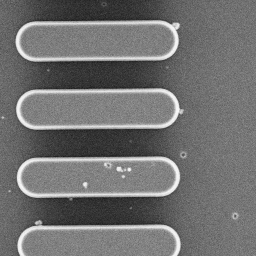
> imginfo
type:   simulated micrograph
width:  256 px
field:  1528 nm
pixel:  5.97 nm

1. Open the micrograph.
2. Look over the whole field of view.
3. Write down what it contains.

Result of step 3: groups of lines, slits or small figures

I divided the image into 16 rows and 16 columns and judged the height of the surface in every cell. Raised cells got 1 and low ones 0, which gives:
0000000000000000
0011111111000000
0111111111100000
0011111111000000
0000000000000000
0000000000000000
0111111111100000
0111111111100000
0000000000000000
0000000000000000
0111111111100000
0111111111100000
0000000000000000
0000000000000000
0011111111100000
0111111111100000